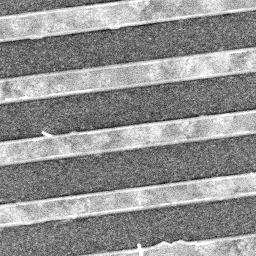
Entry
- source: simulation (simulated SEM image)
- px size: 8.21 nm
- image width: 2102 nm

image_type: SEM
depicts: one or a few lines or trenches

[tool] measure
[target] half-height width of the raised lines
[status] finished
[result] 178 nm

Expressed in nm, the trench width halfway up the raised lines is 326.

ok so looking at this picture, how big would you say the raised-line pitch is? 506 nm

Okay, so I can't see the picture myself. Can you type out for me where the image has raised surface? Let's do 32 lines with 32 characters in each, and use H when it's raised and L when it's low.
LLLLLLLLLLLLLLHHHHHHHHHHHHHHHHHH
LLLLLLHHHHHHHHHHHHHHHHHHHHHHHLLL
HHHHHHHHHHHHHHHHHHHHLLLLLLLLLLLL
HHHHHHHHHHHHHHLLLLLLLLLLLLLLLLLL
HHHHHHLLLLLLLLLLLLLLLLLLLLLLLLLL
LLLLLLLLLLLLLLLLLLLLLLLLLLLLLLLL
LLLLLLLLLLLLLLLLLLLLLLLLLLLLHHHH
LLLLLLLLLLLLLLLLLLLLLHHHHHHHHHHH
LLLLLLLLLLLLLHHHHHHHHHHHHHHHHHHH
LLLLLHHHHHHHHHHHHHHHHHHHHHLLLLLL
HHHHHHHHHHHHHHHHHHLLLLLLLLLLLLLL
HHHHHHHHHHLLLLLLLLLLLLLLLLLLLLLL
HHLLLLLLLLLLLLLLLLLLLLLLLLLLLLLL
LLLLLLLLLLLLLLLLLLLLLLLLLLLLLLLL
LLLLLLLLLLLLLLLLLLLLLLLLLLHHHHHH
LLLLLLLLLLLLLLLLLLHHHHHHHHHHHHHH
LLLLLLLLLLLHHHHHHHHHHHHHHHHHHHHH
LLLHHHHHHHHHHHHHHHHHHHHHLLLLLLLL
HHHHHHHHHHHHHHHHLLLLLLLLLLLLLLLL
HHHHHHHHLLLLLLLLLLLLLLLLLLLLLLLL
LLLLLLLLLLLLLLLLLLLLLLLLLLLLLLLL
LLLLLLLLLLLLLLLLLLLLLLLLLLLLLLLL
LLLLLLLLLLLLLLLLLLLLLLLLLHHHHHHH
LLLLLLLLLLLLLLLLLHHHHHHHHHHHHHHH
LLLLLLLLLLHHHHHHHHHHHHHHHHHHHHLL
LHHHHHHHHHHHHHHHHHHHHHLLLLLLLLLL
HHHHHHHHHHHHHHLLLLLLLLLLLLLLLLLL
HHHHHHLLLLLLLLLLLLLLLLLLLLLLLLLL
LLLLLLLLLLLLLLLLLLLLLLLLLLLLLLLL
LLLLLLLLLLLLLLLLLLLLLLLLLLLLLLLH
LLLLLLLLLLLLLLLLLLLLHHHHHHHHHHHH
LLLLLLLLLLLLLLLHHHHHHHHHHHHHHHHH